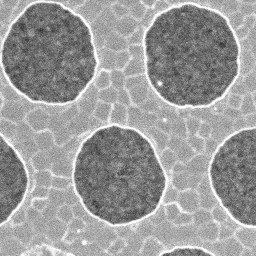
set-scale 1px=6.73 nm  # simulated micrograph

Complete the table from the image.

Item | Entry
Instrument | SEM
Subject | raised bodies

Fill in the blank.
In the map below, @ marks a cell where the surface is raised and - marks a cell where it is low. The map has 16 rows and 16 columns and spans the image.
--@@-------@@---
-@@@@----@@@@@--
@@@@@@---@@@@@@-
@@@@@@---@@@@@@-
@@@@@@---@@@@@@-
-@@@@-----@@@@--
---@-------@@---
----------------
------@@@-----@@
@----@@@@@---@@@
@@---@@@@@---@@@
@@---@@@@@---@@@
@----@@@@@----@@
@-----@@@-----@@
----------------
-----------@----